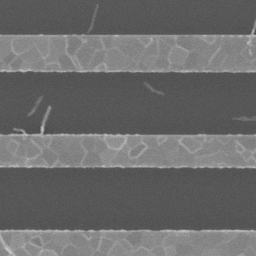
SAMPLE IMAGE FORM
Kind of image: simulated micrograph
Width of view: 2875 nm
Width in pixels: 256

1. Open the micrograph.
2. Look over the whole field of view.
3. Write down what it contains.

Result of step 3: lines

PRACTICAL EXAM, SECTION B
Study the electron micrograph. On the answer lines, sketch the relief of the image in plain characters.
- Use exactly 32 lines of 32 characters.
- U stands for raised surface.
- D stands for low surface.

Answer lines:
DDDDDDDDDDDDDDDDDDDDDDDDDDDDDDDD
DDDDDDDDDDDDDDDDDDDDDDDDDDDDDDDD
DDDDDDDDDDDDDDDDDDDDDDDDDDDDDDDD
DDDDDDDDDDDDDDDDDDDDDDDDDDDDDDDD
UUUUUUUUUUUUUUUUUUUUUUUUUUUUUUUU
UUUUUUUUUUUUUUUUUUUUUUUUUUUUUUUU
UUUUUUUUUUUUUUUUUUUUUUUUUUUUUUUU
UUUUUUUUUUUUUUUUUUUUUUUUUUUUUUUU
UUUUUUUUUUUUUUUUUUUUUUUUUUUUUUUU
DDDDDDDDDDDDDDDDDDDDDDDDDDDDDDDD
DDDDDDDDDDDDDDDDDDDDDDDDDDDDDDDD
DDDDDDDDDDDDDDDDDDDDDDDDDDDDDDDD
DDDDDDDDDDDDDDDDDDDDDDDDDDDDDDDD
DDDDDDDDDDDDDDDDDDDDDDDDDDDDDDDD
DDDDDDDDDDDDDDDDDDDDDDDDDDDDDDDD
DDDDDDDDDDDDDDDDDDDDDDDDDDDDDDDD
DDDDDDDDDDDDDDDDDDDDDDDDDDDDDDDD
UUUUUUUUUUUUUUUUUUUUUUUUUUUUUUUU
UUUUUUUUUUUUUUUUUUUUUUUUUUUUUUUU
UUUUUUUUUUUUUUUUUUUUUUUUUUUUUUUU
UUUUUUUUUUUUUUUUUUUUUUUUUUUUUUUU
DDDDDDDDDDDDDDDDDDDDDDDDDDDDDDDD
DDDDDDDDDDDDDDDDDDDDDDDDDDDDDDDD
DDDDDDDDDDDDDDDDDDDDDDDDDDDDDDDD
DDDDDDDDDDDDDDDDDDDDDDDDDDDDDDDD
DDDDDDDDDDDDDDDDDDDDDDDDDDDDDDDD
DDDDDDDDDDDDDDDDDDDDDDDDDDDDDDDD
DDDDDDDDDDDDDDDDDDDDDDDDDDDDDDDD
DDDDDDDDDDDDDDDDDDDDDDDDDDDDDDDD
UUUUUUUUUUUUUUUUUUUUUUUUUUUUUUUU
UUUUUUUUUUUUUUUUUUUUUUUUUUUUUUUU
UUUUUUUUUUUUUUUUUUUUUUUUUUUUUUUU